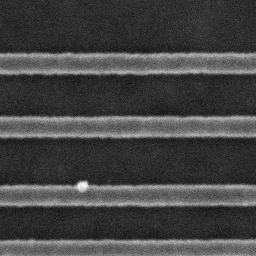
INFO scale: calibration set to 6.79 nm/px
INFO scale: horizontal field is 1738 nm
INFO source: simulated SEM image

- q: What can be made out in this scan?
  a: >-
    lines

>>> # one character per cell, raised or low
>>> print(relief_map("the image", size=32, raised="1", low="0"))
00000000000000000000000000000000
00000000000000000000000000000000
00000000000000000000000000000000
00000000000000000000000000000000
00000000000000000000000000000000
00000000000000000000000000000000
00000000000000000000000000000000
11111111111111111111111111111111
11111111111111111111111111111111
00000000000000000000000000000000
00000000000000000000000000000000
00000000000000000000000000000000
00000000000000000000000000000000
00000000000000000000000000000000
00000000000000000000000000000000
11111111111111111111111111111111
11111111111111111111111111111111
00000000000000000000000000000000
00000000000000000000000000000000
00000000000000000000000000000000
00000000000000000000000000000000
00000000000000000000000000000000
00000000000000000000000000000000
11111111111111111111111111111111
11111111111111111111111111111111
11111111111111111111111111111111
00000000000000000000000000000000
00000000000000000000000000000000
00000000000000000000000000000000
00000000000000000000000000000000
11111111111111111111111111111111
11111111111111111111111111111111